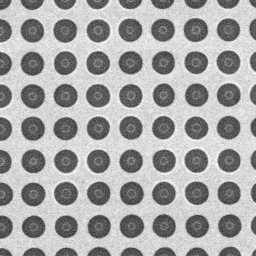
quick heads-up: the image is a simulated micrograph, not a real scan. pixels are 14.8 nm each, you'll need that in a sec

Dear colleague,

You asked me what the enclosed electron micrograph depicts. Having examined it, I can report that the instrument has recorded an array of small figures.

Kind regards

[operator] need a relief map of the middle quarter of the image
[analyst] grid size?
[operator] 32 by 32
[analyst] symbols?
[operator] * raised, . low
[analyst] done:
...**.......**......**......**..
...***.....***.....***.....****.
..*****...******..******..******
********************************
********************************
..*****...*****....****....****.
...***.....***.....***.....****.
....*.......*.......**......**..
....*.......*.......**......**..
...***......**.....***.....****.
..*****....****....****...******
********************************
********************************
..*****....****....****....****.
...***.....***.....***......**..
....**......**......**......**..
....**......**......**......**..
...***.....***.....***......**..
..*****...*****....****....****.
********************************
********************************
..*****...******..******...****.
...***.....***.....****.....**..
....**......**......**......**..
....*.......**......**......**..
....**.....***.....***......**..
...***.....****....****....****.
.*******.***********************
********************************
..*****...******..******...*****
...***.....****....****.....**..
...***......**......**......**..